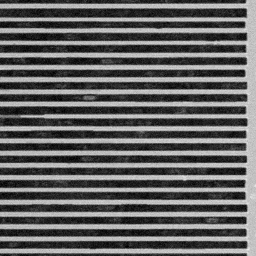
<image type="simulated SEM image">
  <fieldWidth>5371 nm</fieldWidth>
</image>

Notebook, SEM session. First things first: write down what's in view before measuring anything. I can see parallel lines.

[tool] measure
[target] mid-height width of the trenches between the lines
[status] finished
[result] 8.63 pixels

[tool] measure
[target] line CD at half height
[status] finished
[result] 0.0892 microns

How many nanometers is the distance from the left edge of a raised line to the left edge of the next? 257